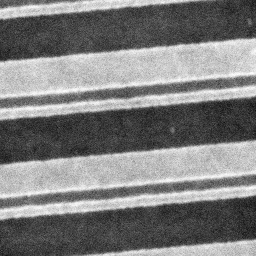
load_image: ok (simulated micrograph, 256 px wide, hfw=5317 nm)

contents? lines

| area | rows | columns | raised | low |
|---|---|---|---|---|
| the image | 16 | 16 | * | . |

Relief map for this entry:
******..........
................
...............*
.....***********
****************
****************
**********......
................
................
.........*******
****************
****************
************....
**..............
................
...........*****